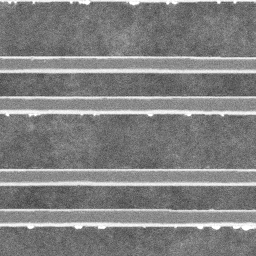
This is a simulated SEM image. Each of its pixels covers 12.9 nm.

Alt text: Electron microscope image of lines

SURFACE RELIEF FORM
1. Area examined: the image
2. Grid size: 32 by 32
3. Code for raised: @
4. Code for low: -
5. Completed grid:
--------------------------------
--------------------------------
--------------------------------
--------------------------------
--------------------------------
--------------------------------
--------------------------------
@@@@@@@@@@@@@@@@@@@@@@@@@@@@@@@@
@@@@@@@@@@@@@@@@@@@@@@@@@@@@@@@@
--------------------------------
--------------------------------
--------------------------------
@@@@@@@@@@@@@@@@@@@@@@@@@@@@@@@@
@@@@@@@@@@@@@@@@@@@@@@@@@@@@@@@@
--------------------------------
--------------------------------
--------------------------------
--------------------------------
--------------------------------
--------------------------------
--------------------------------
@@@@@@@@@@@@@@@@@@@@@@@@@@@@@@@@
@@@@@@@@@@@@@@@@@@@@@@@@@@@@@@@@
--------------------------------
--------------------------------
--------------------------------
@@@@@@@@@@@@@@@@@@@@@@@@@@@@@@@@
@@@@@@@@@@@@@@@@@@@@@@@@@@@@@@@@
--------------------------------
--------------------------------
--------------------------------
--------------------------------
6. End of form